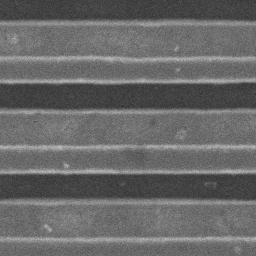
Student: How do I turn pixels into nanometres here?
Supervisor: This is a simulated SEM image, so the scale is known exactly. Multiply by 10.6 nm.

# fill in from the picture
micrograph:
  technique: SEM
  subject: lines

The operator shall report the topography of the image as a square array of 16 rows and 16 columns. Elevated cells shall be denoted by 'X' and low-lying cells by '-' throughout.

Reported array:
----------------
---X-XX---XXXX--
XXXXXXXXXXXXXXXX
XXXXXXXXXXXXXXXX
XXXXXXXXXXXXXXXX
----------------
----------------
XXXXXXXXXXXXXXXX
XXXXXXXXXXXXXXXX
XXXXXXXXXXXXXXXX
XXXXXXXXXXXXXXXX
----------------
----------------
XXXXXXXXXXXXXXXX
XXXXXXXXXXXXXXXX
XXXXXXXXXXXXXXXX